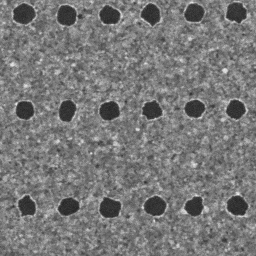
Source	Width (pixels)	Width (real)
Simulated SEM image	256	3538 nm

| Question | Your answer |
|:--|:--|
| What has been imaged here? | a regular array of holes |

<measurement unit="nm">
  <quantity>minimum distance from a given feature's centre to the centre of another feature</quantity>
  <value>577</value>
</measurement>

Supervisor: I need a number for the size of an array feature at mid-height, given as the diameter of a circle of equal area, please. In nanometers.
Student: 285